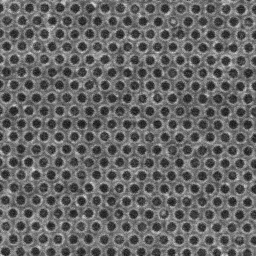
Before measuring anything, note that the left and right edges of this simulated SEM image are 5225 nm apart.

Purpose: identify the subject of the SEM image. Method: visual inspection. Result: a regular array of holes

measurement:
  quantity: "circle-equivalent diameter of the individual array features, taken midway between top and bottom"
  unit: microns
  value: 0.21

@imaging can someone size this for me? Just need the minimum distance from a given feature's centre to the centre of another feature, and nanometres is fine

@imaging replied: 295